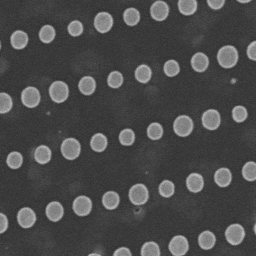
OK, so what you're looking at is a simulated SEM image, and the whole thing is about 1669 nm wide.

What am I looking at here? a regular array of raised bodies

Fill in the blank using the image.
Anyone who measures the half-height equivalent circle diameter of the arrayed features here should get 17.2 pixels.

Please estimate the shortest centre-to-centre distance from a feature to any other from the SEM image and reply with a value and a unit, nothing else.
0.186 um